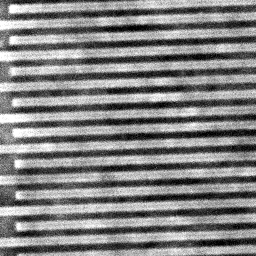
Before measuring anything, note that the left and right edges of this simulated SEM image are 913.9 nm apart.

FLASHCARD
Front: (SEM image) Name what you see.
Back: parallel lines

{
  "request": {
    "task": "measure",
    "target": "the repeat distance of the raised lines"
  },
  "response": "0.0554 um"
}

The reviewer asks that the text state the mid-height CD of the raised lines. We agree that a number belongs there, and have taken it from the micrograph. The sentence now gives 6.75 pixels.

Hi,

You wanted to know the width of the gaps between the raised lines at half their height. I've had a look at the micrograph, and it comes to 30.3 nm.